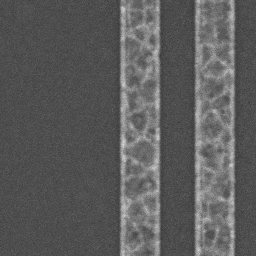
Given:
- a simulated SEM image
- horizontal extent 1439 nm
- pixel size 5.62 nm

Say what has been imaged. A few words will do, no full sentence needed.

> one or a few lines or trenches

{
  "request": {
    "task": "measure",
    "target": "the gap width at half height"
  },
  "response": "222 nanometers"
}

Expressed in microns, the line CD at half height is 0.198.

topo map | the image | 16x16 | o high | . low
........oo..oo..
........oo..oo..
........oo..oo..
........oo..oo..
........oo..oo..
........oo..oo..
........oo..oo..
........oo..oo..
........oo..oo..
........oo..oo..
........oo..oo..
........oo..ooo.
........oo..oo..
........oo..oo..
........oo..oo..
........oo..oo..